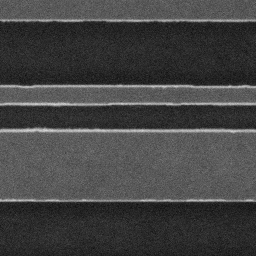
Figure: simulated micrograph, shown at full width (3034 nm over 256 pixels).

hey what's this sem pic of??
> lines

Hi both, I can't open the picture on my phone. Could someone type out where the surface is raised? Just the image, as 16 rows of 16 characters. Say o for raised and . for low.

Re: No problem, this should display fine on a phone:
oooooooooooooooo
................
................
................
................
oooooooooooooooo
oooooooooooooooo
oooooooooooooooo
oooooooooooooooo
oooooooooooooooo
oooooooooooooooo
oooooooooooooooo
oooooooooooooooo
................
................
................